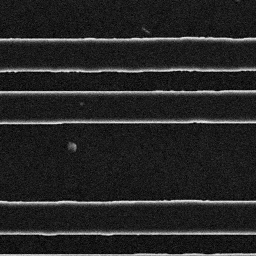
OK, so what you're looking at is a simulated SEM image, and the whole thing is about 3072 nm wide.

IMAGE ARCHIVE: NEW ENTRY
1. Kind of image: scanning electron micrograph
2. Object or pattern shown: lines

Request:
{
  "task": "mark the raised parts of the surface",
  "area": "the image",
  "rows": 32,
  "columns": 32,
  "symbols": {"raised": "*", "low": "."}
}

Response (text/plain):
................................
................................
................................
................................
................................
********************************
********************************
********************************
********************************
................................
................................
********************************
********************************
********************************
********************************
................................
................................
................................
................................
................................
................................
................................
................................
................................
................................
********************************
********************************
********************************
********************************
................................
................................
................................